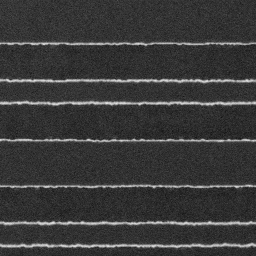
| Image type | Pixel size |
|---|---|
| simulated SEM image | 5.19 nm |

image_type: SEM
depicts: lines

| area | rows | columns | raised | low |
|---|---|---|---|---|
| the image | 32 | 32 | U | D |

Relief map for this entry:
UUUUUUUUUUUUUUUUUUUUUUUUUUUUUUUU
UUUUUUUUUUUUUUUUUUUUUUUUUUUUUUUU
UUUUUUUUUUUUUUUUUUUUUUUUUUUUUUUU
UUUUUUUUUUUUUUUUUUUUUUUUUUUUUUUU
UUUUUUUUUUUUUUUUUUUUUUUUUUUUUUUU
DUUUUUUUUUUUUUUUUUUUDDUUUUUUUUUU
DDDDDDDDDDDDDDDDDDDDDDDDDDDDDDDD
DDDDDDDDDDDDDDDDDDDDDDDDDDDDDDDD
DDDDDDDDDDDDDDDDDDDDDDDDDDDDDDDD
DDDDDDDDDDDDDDDDDDDDDDDDDDDDDDDD
UUUUUUUUUUUUUUUUUUUUUUUUUUUUUUUU
UUUUUUUUUUUUUUUUUUUUUUUUUUUUUUUU
UUUUUUUUUUUUUUUUUUUUUUUUUUUUUUUU
DDDDDDDDDDDDDDDDDDDDDDDDDDDDDDDD
DDDDDDDDDDDDDDDDDDDDDDDDDDDDDDDD
DDDDDDDDDDDDDDDDDDDDDDDDDDDDDDDD
DDDDDDDDDDDDDDDDDDDDDDDDDDDDDDDD
UUUUDUUUUUUUDDUDUUDUDUUDDUDDUDUU
UUUUUUUUUUUUUUUUUUUUUUUUUUUUUUUU
UUUUUUUUUUUUUUUUUUUUUUUUUUUUUUUU
UUUUUUUUUUUUUUUUUUUUUUUUUUUUUUUU
UUUUUUUUUUUUUUUUUUUUUUUUUUUUUUUU
UUUUUUUUUUUUUUUUUUUUUUUUUUUUUUUU
DDDDDDDDDDDDDDDDDDDDDDDDDDDDDDDD
DDDDDDDDDDDDDDDDDDDDDDDDDDDDDDDD
DDDDDDDDDDDDDDDDDDDDDDDDDDDDDDDD
DDDDDDDDDDDDDDDDDDDDDDDDDDDDDDDD
DDDDDDDDDDDDDDDDDDDDDDDDDDDDDDDD
UUUUUUUUUUUUUUUUUUUUUUUUUUUUUUUU
UUUUUUUUUUUUUUUUUUUUUUUUUUUUUUUU
UUUUUUUUUUUUUUUUUUUUUUUUUUUUUUUU
DDDDDDDDDDDDDDDDDDDDDDDDDDDDDDDD